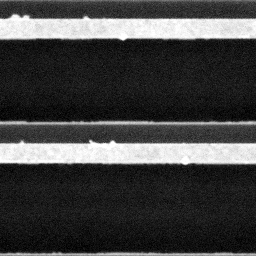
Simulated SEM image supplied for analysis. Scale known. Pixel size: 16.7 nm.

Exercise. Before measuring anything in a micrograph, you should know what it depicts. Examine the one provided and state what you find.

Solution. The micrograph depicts lines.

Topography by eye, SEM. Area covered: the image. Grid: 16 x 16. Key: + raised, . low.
++++++++++++++++
++++++++++++++++
................
................
................
................
................
................
++++++++++++++++
++++++++++++++++
................
................
................
................
................
................